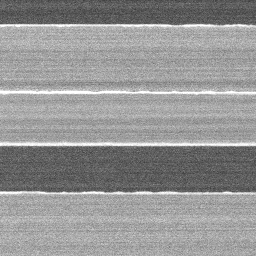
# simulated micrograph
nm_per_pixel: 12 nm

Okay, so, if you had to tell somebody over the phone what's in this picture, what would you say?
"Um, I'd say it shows lines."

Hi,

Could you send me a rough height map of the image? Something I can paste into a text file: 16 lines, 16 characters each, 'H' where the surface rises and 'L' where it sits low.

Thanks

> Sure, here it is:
LLLLLLLLLLLLLLLL
LLLLLLLLLLLLLLLL
HHHHHHHHHHHHHHHH
HHHHHHHHHHHHHHHH
HHHHHHHHHHHHHHHH
HHHHHHHHHHHHHHHH
HHHHHHHHHHHHHHHH
HHHHHHHHHHHHHHHH
HHHHHHHHHHHHHHHH
LLLLLLLLLLLLLLLL
LLLLLLLLLLLLLLLL
LLLLLLLLLLLLLLLL
HHHHHHHHHHHHHHHH
HHHHHHHHHHHHHHHH
HHHHHHHHHHHHHHHH
HHHHHHHHHHHHHHHH